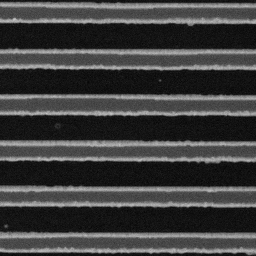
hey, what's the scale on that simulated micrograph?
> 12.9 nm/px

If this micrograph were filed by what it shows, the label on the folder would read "lines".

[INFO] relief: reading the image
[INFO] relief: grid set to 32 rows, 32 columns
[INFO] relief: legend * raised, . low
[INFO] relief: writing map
**..*...........................
********************************
********************************
................................
................................
................................
********************************
********************************
********************************
................................
................................
................................
********************************
********************************
................................
................................
................................
................................
********************************
********************************
................................
................................
................................
................................
********************************
********************************
................................
................................
................................
********************************
********************************
********************************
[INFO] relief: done